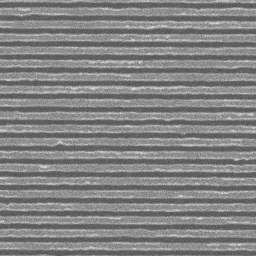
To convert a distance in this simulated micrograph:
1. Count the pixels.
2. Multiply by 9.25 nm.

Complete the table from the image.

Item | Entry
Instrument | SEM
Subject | parallel lines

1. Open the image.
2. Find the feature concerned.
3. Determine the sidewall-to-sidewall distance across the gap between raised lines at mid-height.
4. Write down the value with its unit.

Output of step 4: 52.1 nanometres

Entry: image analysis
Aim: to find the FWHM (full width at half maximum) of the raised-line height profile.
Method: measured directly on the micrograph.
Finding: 7.5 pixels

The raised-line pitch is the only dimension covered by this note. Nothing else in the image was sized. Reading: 121 nm